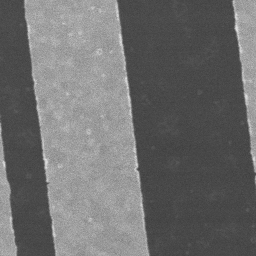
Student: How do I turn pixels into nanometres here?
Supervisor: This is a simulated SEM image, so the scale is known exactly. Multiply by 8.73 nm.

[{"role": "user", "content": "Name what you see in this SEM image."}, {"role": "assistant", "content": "one or a few lines or trenches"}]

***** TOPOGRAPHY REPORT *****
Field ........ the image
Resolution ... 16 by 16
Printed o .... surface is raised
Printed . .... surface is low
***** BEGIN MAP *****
..ooooo........o
..ooooo........o
..oooooo.......o
..oooooo.......o
..oooooo.......o
..oooooo.......o
..oooooo.......o
..oooooo.......o
...ooooo........
...ooooo........
...oooooo.......
o..oooooo.......
o..oooooo.......
o..oooooo.......
o..oooooo.......
o..oooooo.......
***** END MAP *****